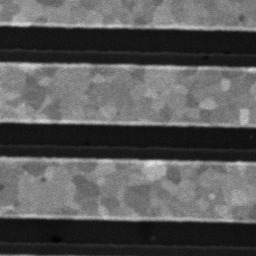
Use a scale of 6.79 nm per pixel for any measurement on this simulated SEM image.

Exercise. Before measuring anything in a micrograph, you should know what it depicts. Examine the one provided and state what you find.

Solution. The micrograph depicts lines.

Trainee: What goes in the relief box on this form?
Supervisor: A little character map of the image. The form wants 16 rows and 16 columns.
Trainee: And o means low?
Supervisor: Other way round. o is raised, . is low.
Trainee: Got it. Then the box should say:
oooooooooooooooo
oooooooooooooooo
................
................
oooooooooooooooo
oooooooooooooooo
oooooooooooooooo
oooooooooooooooo
................
................
oooooooooooooooo
oooooooooooooooo
oooooooooooooooo
oooooooooooooooo
................
................